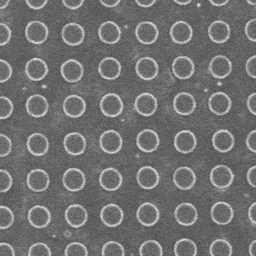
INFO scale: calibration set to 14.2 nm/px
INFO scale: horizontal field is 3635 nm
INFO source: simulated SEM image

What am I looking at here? a regular array of raised bodies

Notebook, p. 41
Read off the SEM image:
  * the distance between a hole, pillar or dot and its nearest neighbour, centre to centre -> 0.507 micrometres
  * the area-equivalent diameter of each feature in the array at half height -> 313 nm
